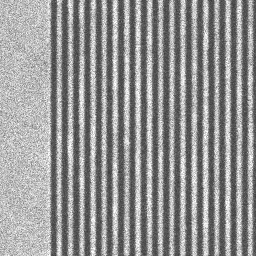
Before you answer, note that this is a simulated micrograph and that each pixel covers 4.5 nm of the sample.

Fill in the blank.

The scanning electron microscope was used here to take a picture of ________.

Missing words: parallel lines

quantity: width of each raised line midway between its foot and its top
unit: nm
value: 21.9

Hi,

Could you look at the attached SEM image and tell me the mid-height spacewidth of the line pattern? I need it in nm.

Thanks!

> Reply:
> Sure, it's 25.9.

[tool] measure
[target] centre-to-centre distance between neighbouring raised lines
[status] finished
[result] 0.0506 micrometres